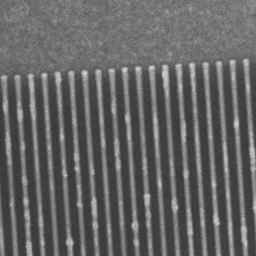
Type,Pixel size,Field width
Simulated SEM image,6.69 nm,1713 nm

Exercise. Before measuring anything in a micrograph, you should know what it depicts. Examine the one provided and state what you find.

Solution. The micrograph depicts parallel lines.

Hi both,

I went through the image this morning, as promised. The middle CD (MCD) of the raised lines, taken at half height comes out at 33.4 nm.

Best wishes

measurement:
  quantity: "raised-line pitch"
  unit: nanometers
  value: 90.1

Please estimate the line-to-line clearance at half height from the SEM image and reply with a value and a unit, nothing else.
53.4 nm